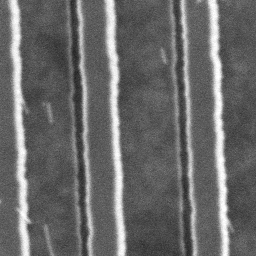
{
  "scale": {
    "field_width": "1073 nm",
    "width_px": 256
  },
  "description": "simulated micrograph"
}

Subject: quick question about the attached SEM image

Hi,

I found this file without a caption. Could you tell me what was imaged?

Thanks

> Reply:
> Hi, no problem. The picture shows lines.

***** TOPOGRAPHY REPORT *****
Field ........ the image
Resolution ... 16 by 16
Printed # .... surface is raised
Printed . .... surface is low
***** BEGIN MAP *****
#....##....##...
#....##....###..
#....##.....##..
#....##.....##..
#....##.....##..
#....##.....##..
#....##.....##..
#....##.....##..
#....##.....##..
#....##.....##..
#....###....##..
##...###....##..
##...###....##..
##...###....##..
##....##....##..
##....##....##..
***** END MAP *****